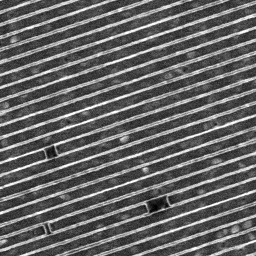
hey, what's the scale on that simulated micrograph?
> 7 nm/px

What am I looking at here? parallel lines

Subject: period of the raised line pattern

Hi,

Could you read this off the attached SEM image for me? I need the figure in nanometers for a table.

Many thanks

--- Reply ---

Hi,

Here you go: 83.3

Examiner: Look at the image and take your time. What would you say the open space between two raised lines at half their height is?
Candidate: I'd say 68.8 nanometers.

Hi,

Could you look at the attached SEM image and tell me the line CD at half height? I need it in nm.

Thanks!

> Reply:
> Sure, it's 14.9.